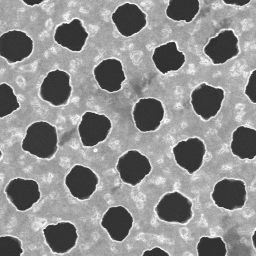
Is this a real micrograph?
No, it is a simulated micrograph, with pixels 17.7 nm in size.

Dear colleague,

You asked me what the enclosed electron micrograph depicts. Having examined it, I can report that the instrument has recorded a regular array of holes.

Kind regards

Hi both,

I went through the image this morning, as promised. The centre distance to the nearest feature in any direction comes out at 972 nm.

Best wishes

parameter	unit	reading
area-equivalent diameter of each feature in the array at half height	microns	0.566